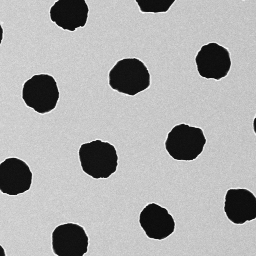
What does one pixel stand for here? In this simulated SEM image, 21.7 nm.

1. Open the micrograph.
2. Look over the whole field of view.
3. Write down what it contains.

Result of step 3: holes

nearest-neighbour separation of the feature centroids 84.9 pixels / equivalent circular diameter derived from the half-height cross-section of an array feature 0.817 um